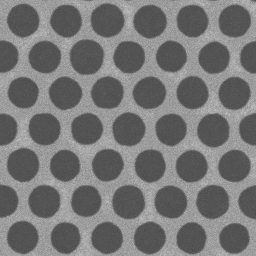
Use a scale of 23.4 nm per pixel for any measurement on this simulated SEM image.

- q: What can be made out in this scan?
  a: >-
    a regular array of holes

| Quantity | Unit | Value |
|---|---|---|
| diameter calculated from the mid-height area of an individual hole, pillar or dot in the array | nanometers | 762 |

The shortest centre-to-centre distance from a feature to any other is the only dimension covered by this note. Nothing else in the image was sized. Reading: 971 nanometers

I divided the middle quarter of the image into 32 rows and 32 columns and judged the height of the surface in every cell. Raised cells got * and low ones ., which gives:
**.......****.......****......**
***......*****.....******....***
****...*************************
..*******....*******...*******..
...*****......*****.....*****...
....***........***.......***....
.....**........**.........**....
.....**........**.........**....
....***........**........***....
....***.......****.......****...
...*****......*****.....******..
********************************
*****..********...********.*****
***......****......*****......**
**.......***........***.......**
**........**........***........*
**........**........***........*
**........**........***........*
**.......****.......***.......**
***.....*****......*****.....***
***************..*********.*****
.*********..********...********.
...*****......*****.....*****...
....***........***.......***....
....***........***.......***....
....***........**........***....
....***........***.......***....
....****......****.......***....
...*****.....******.....*****...
.*******************...********.
****...********...*******...****
***.....*****......*****.....***